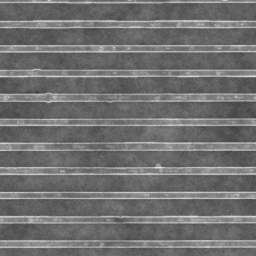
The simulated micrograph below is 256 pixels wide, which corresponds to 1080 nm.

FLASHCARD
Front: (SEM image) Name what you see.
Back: parallel lines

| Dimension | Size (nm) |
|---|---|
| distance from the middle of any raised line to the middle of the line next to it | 103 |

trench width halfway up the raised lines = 72.8 nm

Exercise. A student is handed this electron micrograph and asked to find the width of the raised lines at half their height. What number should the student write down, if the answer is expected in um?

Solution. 0.0285